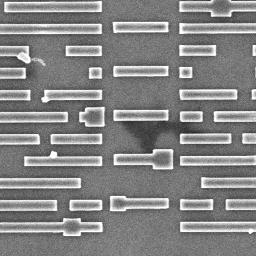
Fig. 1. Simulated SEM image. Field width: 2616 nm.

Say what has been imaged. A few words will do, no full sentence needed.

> wiring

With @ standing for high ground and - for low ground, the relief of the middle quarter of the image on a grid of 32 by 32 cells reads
--------------------------------
------@@@----@@@@@@@@@@@@@---@@@
------@@@----@@@@@@@@@@@@@---@@@
--------------------------------
--------------------------------
--------------------------------
--------------------------------
@@@@@@@@@--------------------@@@
@@@@@@@@@--------------------@@@
--------------------------------
--------------------------------
-----@@@@@----------------------
@---@@@@@@---@@@@@@@@@@@@@---@@@
@---@@@@@@---@@@@@@@@@@@@@---@@@
-----@@@@@----------------------
--------------------------------
--------------------------------
--------------------------------
@@@@@@@@@--------------------@@@
@@@@@@@@@--------------------@@@
--------------------------------
--------------------------------
----------------------@@@@@-----
@@@@@@@@@----@@@@@@@@@@@@@@--@@@
@@@@@@@@@----@@@@@@@@@@@@@@--@@@
----------------------@@@@@-----
--------------------------------
--------------------------------
--------------------------------
@@@@----------------------------
@@@@----------------------------
--------------------------------